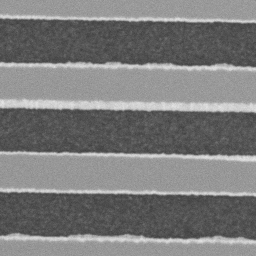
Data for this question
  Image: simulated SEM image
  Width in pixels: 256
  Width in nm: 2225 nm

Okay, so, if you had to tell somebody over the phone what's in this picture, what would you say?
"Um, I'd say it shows lines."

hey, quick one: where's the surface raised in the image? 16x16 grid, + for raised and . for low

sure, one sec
++++++++++++++++
................
................
................
++++++++++++++++
++++++++++++++++
++++++++++++++++
................
................
................
++++++++++++++++
++++++++++++++++
................
................
................
++++++++++++++++